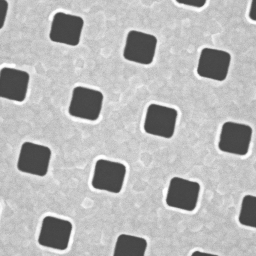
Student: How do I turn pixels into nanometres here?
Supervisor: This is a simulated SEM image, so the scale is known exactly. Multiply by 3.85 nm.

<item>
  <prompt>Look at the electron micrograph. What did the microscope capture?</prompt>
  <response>a regular array of holes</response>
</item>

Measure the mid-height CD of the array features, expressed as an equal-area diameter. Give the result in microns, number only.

0.127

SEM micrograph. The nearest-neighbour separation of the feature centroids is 292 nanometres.